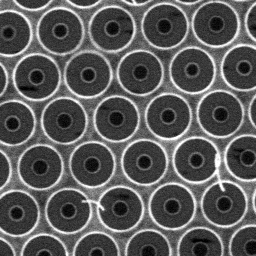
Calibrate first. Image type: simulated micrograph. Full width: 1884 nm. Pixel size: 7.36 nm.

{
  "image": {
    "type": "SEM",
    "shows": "an array of small figures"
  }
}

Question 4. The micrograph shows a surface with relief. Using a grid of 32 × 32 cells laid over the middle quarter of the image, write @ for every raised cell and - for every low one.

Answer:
@----------@@@----@@----@@@----@
-----@@-----@@---@@@@----@@---@@
----@@@@----@----@@@@----@@----@
----@@@@----@@----@@----@@@-----
@----------@@@----------@@@-----
@----------@@@@--------@@@@@----
@@--------@@@@@@------@@@@@@@@--
@@@------@@@@@@@@@---@@@@@@@@@@@
@@@@@@@@@@@----@@@@@@@@------@@@
---@@@@@@@-------@@@@@--------@@
----@@@@@--------@@@@----------@
-----@@@----------@@@----@@----@
@----@@@---@@@@----@----@@@@----
@@---@@@---@@@@----@@---@@@@----
@@----@@---@@@@----@@----@@----@
@@---@@@----------@@@----------@
-----@@@----------@@@@--------@@
-----@@@@--------@@@@@@------@@@
----@@@@@@------@@@@@@@@@---@@@@
--@@@@@@@@@@@@@@@@----@@@@@@@@--
@@@@------@@@@@@--------@@@@@---
@@@--------@@@@----------@@@----
@@----------@@@----------@@@----
@@----@@----@@@----@@@---@@----@
@@---@@@@----@@---@@@@----@----@
@@---@@@@----@@----@@@----@@----
@@---@@@@---@@@----------@@@----
@@----------@@@----------@@@@---
@@@--------@@@@@--------@@@@@@--
@@@@-------@@@@@@@-----@@@@@@@@@
@@@@@----@@@@@@@@@@@@@@@@----@@@
--@@@@@@@@@------@@@@@@--------@